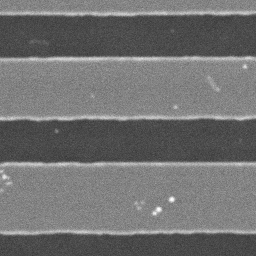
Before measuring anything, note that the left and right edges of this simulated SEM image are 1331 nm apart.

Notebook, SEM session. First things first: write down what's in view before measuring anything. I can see lines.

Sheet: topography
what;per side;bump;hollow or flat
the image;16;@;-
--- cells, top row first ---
@@@@@@@@@@@@@@@@
----------------
----------------
----------------
@@@@@@@@@@@@@@@@
@@@@@@@@@@@@@@@@
@@@@@@@@@@@@@@@@
--@-------------
----------------
----------------
@@@@@@@@@@@@@@@@
@@@@@@@@@@@@@@@@
@@@@@@@@@@@@@@@@
@@@@@@@@@@@@@@@@
@@@@@@@@@@@@@@@@
----------------